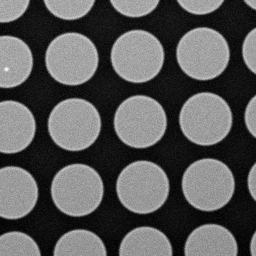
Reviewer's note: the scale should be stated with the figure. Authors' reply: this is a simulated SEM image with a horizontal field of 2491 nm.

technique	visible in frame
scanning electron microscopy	an array of small figures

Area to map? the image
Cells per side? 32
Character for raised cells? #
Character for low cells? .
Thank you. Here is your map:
###...######..######..######...#
###...#####....####.....##......
##..............................
................................
.......###.....####....#####...#
###...######..######..######..##
####..######..######..#######.##
####..######..######..#######..#
####..######..######...#####...#
###....####....####.....###.....
##......##......................
................................
........##......###.....####...#
###....#####...#####...######..#
####..######..#######..######..#
####..#######.#######..######..#
####..######...######..######..#
####...#####...#####....####....
###.....###.....................
................................
................###.....####....
###....#####...#####...######..#
####...######..######..######..#
#####.#######..######..######..#
#####..######..######..######...
####...#####...#####....####....
####....###......##.............
................................
.................##......###....
####....####....#####...#####...
####...######..######..#######.#
#####..######..######..#######.#